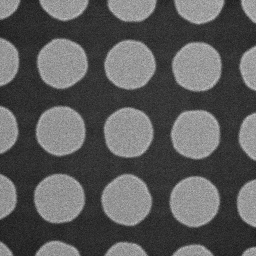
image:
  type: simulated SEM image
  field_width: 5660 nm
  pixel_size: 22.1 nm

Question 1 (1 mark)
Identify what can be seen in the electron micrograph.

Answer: an array of small figures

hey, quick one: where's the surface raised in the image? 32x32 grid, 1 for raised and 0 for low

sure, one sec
11000111111000111110001111110011
11000011110000111110001111100001
00000000000000011100000011000000
00000000000000000000000000000000
00000000000000000000000000000000
10000011100000011100000011000000
11000111111000111110001111100001
11000111111001111110001111100011
11000111111001111110001111110011
11000111110000111110001111100011
00000011100000111100000111100001
00000000000000000000000000000000
00000000000000000000000000000000
00000001100000000000000000000000
11000111110000111100000111100001
11000111110001111110001111100011
11000111111001111110001111100011
11000111110001111110001111100011
10000011110000111100001111100011
00000000000000011000000111000001
00000000000000000000000000000000
00000000000000000000000000000000
10000011100000111000000111000000
11000111110001111100001111100011
11001111110001111110011111100011
11001111110001111110011111100011
10000111110001111110001111100011
00000011100000111100001111000001
00000000000000000000000000000000
00000000000000000000000000000000
00000011000000011000000000000000
10000111110001111100001111000001